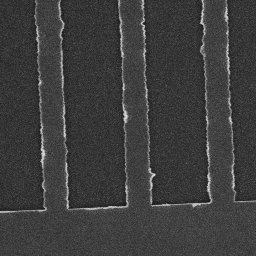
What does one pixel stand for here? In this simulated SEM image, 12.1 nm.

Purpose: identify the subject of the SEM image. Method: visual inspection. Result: one or a few lines or trenches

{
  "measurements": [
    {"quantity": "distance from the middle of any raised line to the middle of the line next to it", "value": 1000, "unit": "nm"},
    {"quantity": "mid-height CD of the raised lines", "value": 295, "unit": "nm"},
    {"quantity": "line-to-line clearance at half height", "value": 714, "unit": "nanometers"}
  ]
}